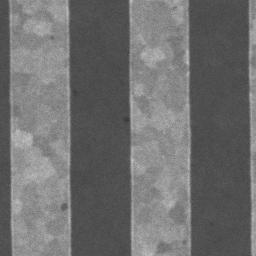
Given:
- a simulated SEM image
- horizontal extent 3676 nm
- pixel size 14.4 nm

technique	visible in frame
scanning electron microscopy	wiring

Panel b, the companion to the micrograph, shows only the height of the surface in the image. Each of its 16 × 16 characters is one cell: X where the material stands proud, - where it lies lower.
-XXX----XXXX----
-XXX----XXXX----
-XXX----XXXX----
-XXX----XXXX----
-XXX----XXXX----
-XXX----XXXX----
-XXX----XXXX----
-XXX----XXXX----
-XXX----XXXX----
-XXX----XXXX----
-XXX----XXXX----
-XXX----XXXX----
-XXX----XXXX----
-XXX----XXXX----
-XXX----XXXX----
-XXX----XXXX----